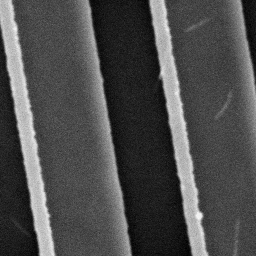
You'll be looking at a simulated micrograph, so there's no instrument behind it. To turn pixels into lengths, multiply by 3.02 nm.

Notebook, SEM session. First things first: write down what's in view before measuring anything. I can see lines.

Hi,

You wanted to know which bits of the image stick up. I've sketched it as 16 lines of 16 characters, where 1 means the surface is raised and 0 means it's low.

1111110001111110
1111110000111110
1111110000111110
1111110000111111
0111110000111111
0111110000111111
0111111000111111
0111111000011111
0111111000011111
0111111000011111
0011111000011111
0011111000011111
0011111100011111
0011111100001111
0011111100001111
0011111100001111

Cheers